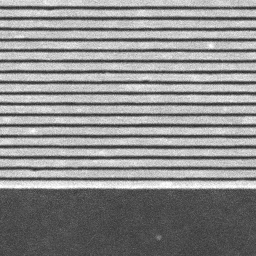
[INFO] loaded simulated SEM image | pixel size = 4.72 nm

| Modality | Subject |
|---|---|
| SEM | parallel lines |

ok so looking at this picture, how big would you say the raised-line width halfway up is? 7.12 pixels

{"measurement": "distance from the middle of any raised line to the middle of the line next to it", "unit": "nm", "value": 50.5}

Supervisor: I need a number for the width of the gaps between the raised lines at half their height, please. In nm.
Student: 16.5